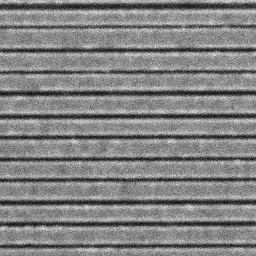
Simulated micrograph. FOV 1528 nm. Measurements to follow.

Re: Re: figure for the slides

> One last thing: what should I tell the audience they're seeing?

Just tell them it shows parallel lines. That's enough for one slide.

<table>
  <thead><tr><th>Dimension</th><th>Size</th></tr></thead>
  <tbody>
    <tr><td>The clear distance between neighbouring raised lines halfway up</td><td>31.3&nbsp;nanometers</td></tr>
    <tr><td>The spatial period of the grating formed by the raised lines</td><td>0.13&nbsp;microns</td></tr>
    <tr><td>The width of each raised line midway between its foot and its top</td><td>0.0985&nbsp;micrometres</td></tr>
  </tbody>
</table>